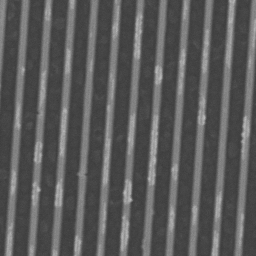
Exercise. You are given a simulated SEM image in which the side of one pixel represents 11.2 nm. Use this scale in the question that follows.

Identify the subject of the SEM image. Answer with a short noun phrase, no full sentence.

parallel lines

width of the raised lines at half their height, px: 5.99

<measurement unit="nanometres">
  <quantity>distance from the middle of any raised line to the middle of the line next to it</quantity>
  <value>256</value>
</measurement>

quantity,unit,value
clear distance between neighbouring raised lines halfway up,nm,191